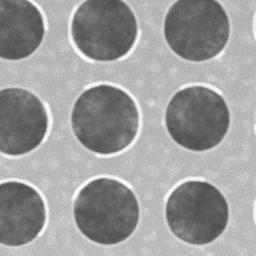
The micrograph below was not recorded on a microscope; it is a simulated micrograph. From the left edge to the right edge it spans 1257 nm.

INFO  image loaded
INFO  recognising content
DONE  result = holes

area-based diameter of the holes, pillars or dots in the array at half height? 65.6 px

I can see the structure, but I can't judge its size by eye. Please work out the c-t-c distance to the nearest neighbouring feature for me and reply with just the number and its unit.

448 nm